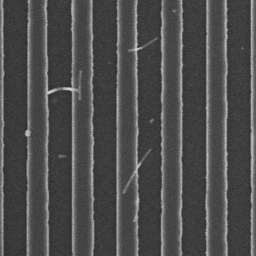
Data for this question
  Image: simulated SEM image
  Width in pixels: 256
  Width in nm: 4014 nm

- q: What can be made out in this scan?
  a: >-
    lines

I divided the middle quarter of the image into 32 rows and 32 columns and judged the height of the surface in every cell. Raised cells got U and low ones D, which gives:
DDUUUUUDDDDDDUUUUUDDDDDDDUUUUDDD
DDUUUUUDDDDDDUUUUUDDDDDDDUUUUDDD
DDUUUUUDDDDDDUUUUUDDDDDDDUUUUDDD
DDUUUUUDDDDDDUUUUUDDDDDDDUUUUDDD
DDUUUUUDDDDDDUUUUUDDDDDDDUUUUDDD
DDUUUUUDDDDDDUUUUUDDDDDDDUUUUDDD
DUUUUUUDDDDDDUUUUUDDDDDDDUUUUDDD
DDUUUUUDDDDDDUUUUUDDDDDDDUUUUDDD
DDUUUUUDDDDDDUUUUUDDDDDDUUUUUDDD
DDUUUUUDDDDDDUUUUUDDDDDDDUUUUDDD
DDUUUUUDDDDDDUUUUUDDDDDDDUUUUUDD
DDUUUUUDDDDDDUUUUUDDDDDDDUUUUDDD
DDUUUUUDDDDDDUUUUUDDDDDDUUUUUDDD
DDUUUUUDDDDDDUUUUUDDDDDDUUUUUDDD
DDUUUUUDDDDDDUUUUUDDDDDDDUUUUDDD
DDUUUUUDDDDDDUUUUUDDDDDDDUUUUDDD
DDUUUUUDDDDDDUUUUUDDDDDDDUUUUDDD
DDUUUUUDDDDDDUUUUUDDDDDDUUUUUDDD
DDUUUUUDDDDDDUUUUUDDDDDDDUUUUDDD
DDUUUUUDDDDDDUUUUUDDDDDDDUUUUDDD
DDUUUUUDDDDDDUUUUUDDDDDDDUUUUDDD
DDUUUUUDDDDDDUUUUUDDDDDDDUUUUDDD
DDUUUUUDDDDDDUUUUUDDDDDDDUUUUDDD
DDUUUUUDDDDDDUUUUUDDDDDDDUUUUDDD
DDUUUUUDDDDDDUUUUUDDDDDDDUUUUDDD
DDUUUUUDDDDDDUUUUUUDDDDDUUUUUDDD
DDUUUUUDDDDDDUUUUUDDDDDDUUUUUDDD
DDUUUUUDDDDDDUUUUUDDDDDDDUUUUDDD
DDUUUUUDDDDDDUUUUUDDDDDDDUUUUDDD
DDUUUUUDDDDDDUUUUUDDDDDDDUUUUDDD
DDUUUUUDDDDDDUUUUUDDDDDDDUUUUDDD
DDUUUUUDDDDDDUUUUUDDDDDDDUUUUDDD